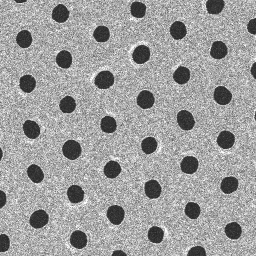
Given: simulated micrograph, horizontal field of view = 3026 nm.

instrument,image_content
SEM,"a regular array of holes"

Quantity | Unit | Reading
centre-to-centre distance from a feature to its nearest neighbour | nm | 520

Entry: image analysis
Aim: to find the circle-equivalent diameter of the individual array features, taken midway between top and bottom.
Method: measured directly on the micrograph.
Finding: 214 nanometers